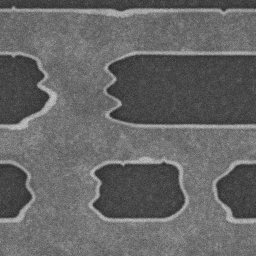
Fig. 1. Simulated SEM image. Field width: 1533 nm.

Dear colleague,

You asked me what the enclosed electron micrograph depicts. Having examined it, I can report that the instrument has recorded one or a few lines or trenches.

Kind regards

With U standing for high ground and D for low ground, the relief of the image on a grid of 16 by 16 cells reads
DDDDDDDDDDDDDDDD
UUUUUUUUUUUUUUUU
UUUUUUUUUUUUUUUU
DDUUUUUUDDDDDDDD
DDDUUUUDDDDDDDDD
DDDUUUUDDDDDDDDD
DDDUUUUDDDDDDDDD
DDUUUUUDDDDDDDDD
UUUUUUUUUUUUUUUU
UUUUUUUUUUUUUUUU
DUUUUUDDDDDUUUDD
DDUUUUDDDDDUUDDD
DDUUUUDDDDDDUUDD
DUUUUUDDDDDUUUUD
UUUUUUUUUUUUUUUU
UUUUUUUUUUUUUUUU